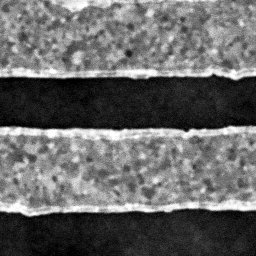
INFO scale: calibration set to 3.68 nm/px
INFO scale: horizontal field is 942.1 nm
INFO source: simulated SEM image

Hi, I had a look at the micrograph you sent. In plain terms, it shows one or a few lines or trenches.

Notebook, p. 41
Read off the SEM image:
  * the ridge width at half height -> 298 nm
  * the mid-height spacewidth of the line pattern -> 201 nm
